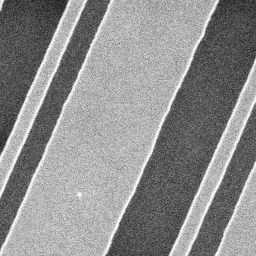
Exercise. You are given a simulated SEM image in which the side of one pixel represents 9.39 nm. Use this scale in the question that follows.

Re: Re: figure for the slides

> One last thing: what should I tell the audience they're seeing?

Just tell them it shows lines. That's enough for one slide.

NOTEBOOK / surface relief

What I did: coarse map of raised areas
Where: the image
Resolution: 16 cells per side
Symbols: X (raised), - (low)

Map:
----XXXXXXXXX---
----XXXXXXXXX---
---XXXXXXXXXX---
---XXXXXXXXX----
--XXXXXXXXXX----
--XXXXXXXXX----X
-XXXXXXXXXX----X
-XXXXXXXXX----XX
-XXXXXXXXX----XX
XXXXXXXXX----XXX
XXXXXXXXX----XXX
XXXXXXXXX----XXX
XXXXXXXX----XXXX
XXXXXXXX----XXXX
XXXXXXX----XXXXX
XXXXXXX----XXXXX